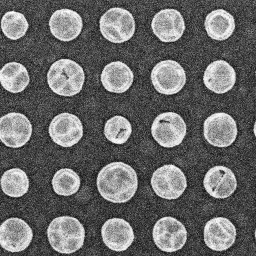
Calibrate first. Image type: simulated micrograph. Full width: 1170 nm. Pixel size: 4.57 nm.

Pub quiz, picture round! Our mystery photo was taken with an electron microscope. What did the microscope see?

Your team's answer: a regular array of raised bodies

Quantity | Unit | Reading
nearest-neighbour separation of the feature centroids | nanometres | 234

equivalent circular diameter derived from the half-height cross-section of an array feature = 140 nanometers